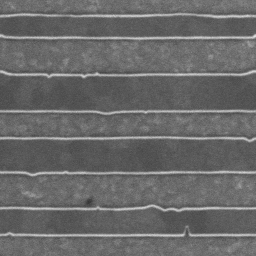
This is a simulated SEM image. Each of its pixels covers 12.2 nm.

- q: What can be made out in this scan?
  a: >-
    one or a few lines or trenches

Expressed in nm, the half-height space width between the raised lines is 440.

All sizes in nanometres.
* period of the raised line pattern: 795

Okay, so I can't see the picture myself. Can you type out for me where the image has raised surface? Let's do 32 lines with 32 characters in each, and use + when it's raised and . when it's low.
................................
................................
++++++++++++++++++++++++++++++++
++++++++++++++++++++++++++++++++
++++++++++++++++++++++++++++++++
................................
................................
................................
................................
++++++++++++++++++++++++++++++++
++++++++++++++++++++++++++++++++
++++++++++++++++++++++++++++++++
++++++++++++++++++++++++++++++++
++++++++++++++++++++++++++++++++
................................
................................
................................
+++++++++++++++++++++++++++++++.
++++++++++++++++++++++++++++++++
++++++++++++++++++++++++++++++++
++++++++++++++++++++++++++++++++
...++++++++++++++++++...........
................................
................................
................................
................................
++++++++++++++++++++++++++++++++
++++++++++++++++++++++++++++++++
++++++++++++++++++++++++++++++++
................................
................................
................................